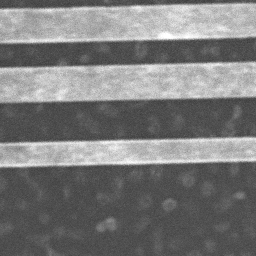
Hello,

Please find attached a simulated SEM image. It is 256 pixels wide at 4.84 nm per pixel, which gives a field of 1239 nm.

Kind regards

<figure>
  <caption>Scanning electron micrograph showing one or a few lines or trenches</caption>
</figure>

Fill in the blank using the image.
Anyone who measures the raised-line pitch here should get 64.6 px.